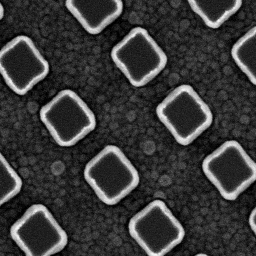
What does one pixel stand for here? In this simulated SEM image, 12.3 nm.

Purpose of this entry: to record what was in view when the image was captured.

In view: raised bodies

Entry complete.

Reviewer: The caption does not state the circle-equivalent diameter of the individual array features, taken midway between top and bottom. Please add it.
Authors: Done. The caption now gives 582 nm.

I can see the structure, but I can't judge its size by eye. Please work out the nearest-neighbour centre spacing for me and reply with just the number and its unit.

890 nanometers